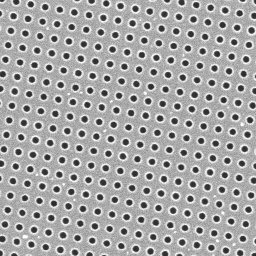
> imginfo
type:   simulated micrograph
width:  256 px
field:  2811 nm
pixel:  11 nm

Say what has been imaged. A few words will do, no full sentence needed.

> a regular array of holes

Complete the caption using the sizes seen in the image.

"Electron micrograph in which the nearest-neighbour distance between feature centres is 160 nm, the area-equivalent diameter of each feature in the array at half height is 72.2 nm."